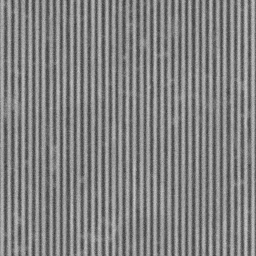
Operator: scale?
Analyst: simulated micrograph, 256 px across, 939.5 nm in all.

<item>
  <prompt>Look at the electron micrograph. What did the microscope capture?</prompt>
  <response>parallel lines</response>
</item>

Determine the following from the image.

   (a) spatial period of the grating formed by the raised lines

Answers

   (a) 25.6 nanometers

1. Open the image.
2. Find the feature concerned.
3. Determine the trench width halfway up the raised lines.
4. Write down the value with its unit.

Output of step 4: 15.1 nm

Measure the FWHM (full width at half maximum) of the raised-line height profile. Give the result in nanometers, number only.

9.2